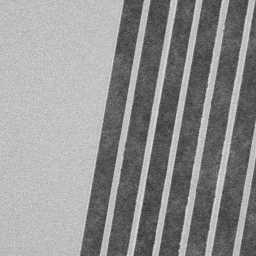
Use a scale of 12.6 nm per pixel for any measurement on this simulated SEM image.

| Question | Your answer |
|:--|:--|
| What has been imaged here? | parallel lines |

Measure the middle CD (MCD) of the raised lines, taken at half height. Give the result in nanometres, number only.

69.7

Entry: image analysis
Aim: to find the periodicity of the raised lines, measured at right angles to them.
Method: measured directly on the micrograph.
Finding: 327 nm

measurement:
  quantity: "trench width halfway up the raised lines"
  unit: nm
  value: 259